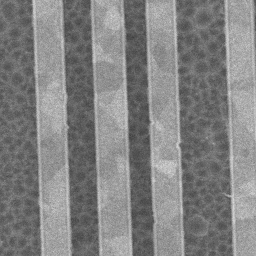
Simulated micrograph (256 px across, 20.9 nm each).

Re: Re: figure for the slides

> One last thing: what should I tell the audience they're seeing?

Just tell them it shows one or a few lines or trenches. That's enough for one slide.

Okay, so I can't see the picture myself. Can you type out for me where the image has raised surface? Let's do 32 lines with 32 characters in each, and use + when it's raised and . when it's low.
....++++....+++...++++......+++.
....++++....+++...++++......+++.
....++++....+++...++++......+++.
....++++....+++....+++......+++.
....++++....+++....+++......++++
....++++....+++....+++......++++
.....+++....+++....+++......++++
.....+++....+++....+++.......+++
.....+++....++++...+++.......+++
.....+++....++++...+++.......+++
.....+++....++++...+++.......+++
.....+++....++++...+++.......+++
.....+++....++++...+++.......+++
.....+++....++++...+++.......+++
.....+++....++++...+++.......+++
.....+++....++++...+++.......+++
.....+++....++++...+++.......+++
.....+++....++++...+++.......+++
.....+++....++++...+++.......+++
.....+++....++++...+++.......+++
.....+++....++++...+++.......+++
.....+++....++++...+++.......+++
.....+++....++++...+++.......+++
.....+++....++++...++++......+++
.....+++....++++...++++......+++
.....+++....++++...++++......+++
.....+++....++++...++++......+++
.....+++.....+++...++++......+++
.....+++.....+++...++++......+++
.....++++....+++...++++......+++
.....++++....+++...++++......+++
.....++++....+++...++++......+++